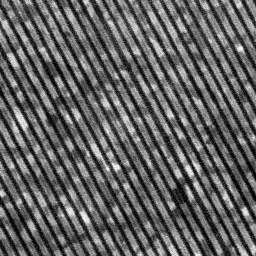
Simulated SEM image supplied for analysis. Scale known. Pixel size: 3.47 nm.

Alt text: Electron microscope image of parallel lines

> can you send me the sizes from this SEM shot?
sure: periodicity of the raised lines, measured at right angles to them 35.7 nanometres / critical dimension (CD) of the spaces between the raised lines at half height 0.018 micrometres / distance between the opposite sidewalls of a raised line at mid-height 0.018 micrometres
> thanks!